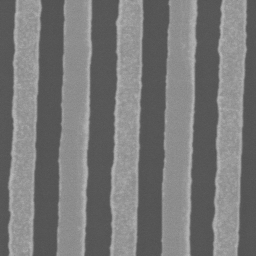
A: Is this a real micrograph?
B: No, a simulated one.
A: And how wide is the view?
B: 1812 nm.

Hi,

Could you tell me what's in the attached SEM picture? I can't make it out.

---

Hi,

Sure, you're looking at lines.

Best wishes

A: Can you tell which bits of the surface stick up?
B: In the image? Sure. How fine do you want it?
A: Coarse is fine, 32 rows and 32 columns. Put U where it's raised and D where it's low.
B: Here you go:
DDUUUDDDUUUDDDDUUUDDDUUUUDDDUUUD
DDUUUDDDUUUDDDDUUUDDDUUUUDDDUUUD
DDUUUDDDUUUDDDDUUUDDDUUUUDDDUUUD
DDUUUDDDUUUDDDDUUUDDDUUUDDDDUUUD
DDUUUDDDUUUDDDDUUUDDDUUUDDDDUUUD
DDUUUDDDUUUDDDDUUUDDDUUUUDDUUUUD
DDUUUDDDUUUDDDDUUUDDDUUUDDDUUUUD
DDUUUDDDUUUDDDDUUUDDDUUUDDDDUUUD
DDUUUDDDUUUDDDDUUUDDDUUUDDDUUUUD
DDUUUDDDUUUDDDDUUUDDDUUUDDDUUUUD
DDUUUDDDUUUDDDDUUUDDDUUUDDDUUUDD
DDUUUDDDUUUDDDDUUUDDDUUUDDDUUUDD
DDUUUDDDUUUDDDDUUDDDDUUUDDDUUUDD
DDUUUDDDUUUDDDUUUDDDDUUUDDDUUUDD
DDUUUDDDUUUDDDUUUDDDDUUUDDDUUUDD
DDUUDDDDUUUDDDUUUDDDDUUUDDDUUUDD
DDUUDDDDUUUDDDUUUDDDDUUUDDDUUUDD
DDUUDDDDUUUDDDUUUDDDDUUUDDDUUUDD
DDUUDDDUUUUDDDUUUDDDDUUUDDDUUUDD
DUUUDDDUUUUDDDUUUDDDDUUUDDDUUUDD
DUUUDDDUUUUDDDUUUDDDDUUUDDDUUUDD
DUUUDDDUUUUDDDUUUDDDUUUUDDDUUUDD
DUUUDDDUUUUDDDUUUDDDUUUUDDDUUUDD
DUUUDDDUUUUDDDUUUDDDUUUUDDDUUUDD
DUUUDDDUUUUDDDUUUDDDUUUUDDDUUUDD
DUUUDDDUUUUDDDUUUDDDUUUUDDDUUUDD
DUUUDDDUUUUDDDUUUDDDUUUUDDDUUUDD
DUUUDDDUUUUDDDUUUDDDUUUUDDDUUUDD
DUUUDDDUUUUDDDUUUDDDUUUUDDDUUUDD
DUUUDDDUUUUDDDUUUDDDUUUUDDDUUUDD
DUUUDDDUUUDDDDUUUDDDUUUUDDDUUUDD
DUUUDDDUUUDDDDUUUDDDUUUUDDDUUUDD